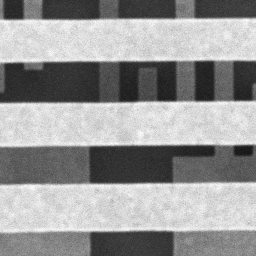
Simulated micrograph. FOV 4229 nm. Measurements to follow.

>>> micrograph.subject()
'wiring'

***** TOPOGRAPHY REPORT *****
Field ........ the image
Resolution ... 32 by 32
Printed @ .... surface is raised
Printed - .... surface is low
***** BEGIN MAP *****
--------------------------------
--------------------------------
-----------@@@@@@@@@@@@@@@@@@@@@
@@@@@@@@@@@@@@@@@@@@@@@@@@@@@@@@
@@@@@@@@@@@@@@@@@@@@@@@@@@@@@@@@
@@@@@@@@@@@@@@@@@@@@@@@@@@@@@@@@
@@@@@@@@@@@@@@@@@@@@@@@@@@@@@@@@
@@@@@@@@@@@@@@@@@@@@@-----------
--------------------------------
--------------------------------
--------------------------------
--------------------------------
--------------------------------
@@@@@@@@@@@@@@@@@@@@@@@@@@@@@@@@
@@@@@@@@@@@@@@@@@@@@@@@@@@@@@@@@
@@@@@@@@@@@@@@@@@@@@@@@@@@@@@@@@
@@@@@@@@@@@@@@@@@@@@@@@@@@@@@@@@
@@@@@@@@@@@@@@@@@@@@@@@@@@@@@@@@
--------------------------------
--------------------------------
--------------------------------
--------------------------------
--------------------------------
@@@@@@@@@@@@@@@@@@@@@@@@@@@@@@@@
@@@@@@@@@@@@@@@@@@@@@@@@@@@@@@@@
@@@@@@@@@@@@@@@@@@@@@@@@@@@@@@@@
@@@@@@@@@@@@@@@@@@@@@@@@@@@@@@@@
@@@@@@@@@@@@@@@@@@@@@@@@@@@@@@@@
@@@@@@@@@@@@@@@@@@@@@@@@@@@@@@@@
--------------------------------
--------------------------------
--------------------------------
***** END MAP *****